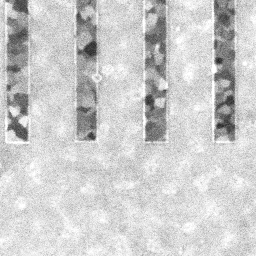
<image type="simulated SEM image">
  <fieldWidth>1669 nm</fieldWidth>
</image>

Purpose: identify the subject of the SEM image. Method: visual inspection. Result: one or a few lines or trenches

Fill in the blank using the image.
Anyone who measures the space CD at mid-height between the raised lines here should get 302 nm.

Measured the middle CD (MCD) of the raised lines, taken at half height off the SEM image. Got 149 nm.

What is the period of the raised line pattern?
450 nanometres